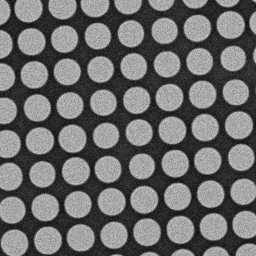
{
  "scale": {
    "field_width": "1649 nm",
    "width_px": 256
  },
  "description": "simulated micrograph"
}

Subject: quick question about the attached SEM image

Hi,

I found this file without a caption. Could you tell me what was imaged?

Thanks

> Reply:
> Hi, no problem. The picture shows an array of small figures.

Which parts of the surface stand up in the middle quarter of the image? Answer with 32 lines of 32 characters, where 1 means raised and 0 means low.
11110011111100111111100111111001
11110011111100111111100111111001
11110011111100011111000011110000
11110001111100001110000000000000
11100000010000000000000000000000
00000000000000000000000001110000
00000000000000001111000011111000
11100000111100011111100111111101
11110001111110011111100111111101
11111001111110011111110111111100
11111001111110011111100011111000
11111001111110001111000001100000
11110000111000000000000000000000
11000000000000000000000000110000
00000000000000000111100011111100
01100000111110001111110011111100
11111000111110001111110011111100
11111001111111001111110011111100
11111001111111001111110011111100
11111100111110001111100001111000
11111000011100000000000000000000
11110000000000000000000000010000
00000000000000000000000001111100
00110000011110000111110001111110
11111000111111001111110011111110
11111100111111001111111001111110
11111100111111001111110001111110
11111100111111000111110000111100
11111100011111000011100000000000
01111000001100000000000000000000
00000000000000000000000000111110
00000000001111000011111000111110